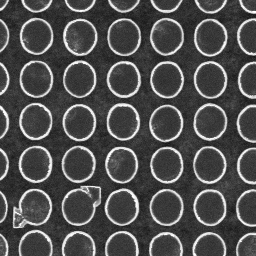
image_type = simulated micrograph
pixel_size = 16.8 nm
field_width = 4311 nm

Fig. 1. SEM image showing a regular array of raised bodies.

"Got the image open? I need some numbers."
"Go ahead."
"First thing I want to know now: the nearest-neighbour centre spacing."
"0.71 micrometres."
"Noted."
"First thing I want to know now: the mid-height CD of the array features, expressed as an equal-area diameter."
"34 px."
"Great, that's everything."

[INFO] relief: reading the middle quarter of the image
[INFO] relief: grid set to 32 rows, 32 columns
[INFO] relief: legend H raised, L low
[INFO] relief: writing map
LHHHHHLLLLLLHHHHHHLLLLLHHHHHLLLL
LHHHHHHLLLLLHHHHHHLLLLHHHHHHHLLL
HHHHHHHHLLLHHHHHHHHLLLHHHHHHHLLL
HHHHHHHHLLLHHHHHHHHLLLHHHHHHHHLL
HHHHHHHHLLLHHHHHHHHLLLHHHHHHHHLL
HHHHHHHHLLLHHHHHHHHLLLHHHHHHHLLL
LHHHHHHLLLLLHHHHHHLLLLLHHHHHHLLL
LLHHHHLLLLLLLHHHHLLLLLLHHHHHLLLL
LLLLLLLLLLLLLLLLLLLLLLLLLLLLLLLL
LLLLLLLLLLLLLLLLLLLLLLLLLLLLLLLL
LLHHHLLLLLLLLHHHHLLLLLLLLLLLLLLL
LHHHHHHLLLLLHHHHHHLLLLLHHHHHLLLL
HHHHHHHLLLLHHHHHHHLLLLHHHHHHHLLL
HHHHHHHHLLLHHHHHHHHLLLHHHHHHHLLL
HHHHHHHHLLLHHHHHHHHLLLHHHHHHHHLL
HHHHHHHHLLLHHHHHHHHLLLHHHHHHHHLL
HHHHHHHHLLLHHHHHHHLLLLHHHHHHHLLL
LHHHHHHLLLLLHHHHHHLLLLHHHHHHHLLL
LLHHHHLLLLLLLHHHHLLLLLLHHHHHLLLL
LLLLLLLLLLLLLLLLLLLLLLLLLLLLLLLL
LLLLLLLLLLLLLLLLLLLLLLLLLLLLLLLL
LHHHHHLLLLLLHHHHLLLLLLLLHHHHLLLL
LHHHHHHLLLLHHHHHHHLLLLLHHHHHHLLL
HHHHHHHHLLLHHHHHHHLLLLHHHHHHHLLL
HHHHHHHHLLLHHHHHHHLLLLHHHHHHHHLL
HHHHHHHHLLLHHHHHHHLLLLHHHHHHHHLL
HHHHHHHLLLLHHHHHHHLLLLHHHHHHHHLL
HHHHHHHLLLLHHHHHHHLLLLHHHHHHHLLL
LHHHHHLLLLLLHHHHHLLLLLLHHHHHLLLL
LLLLLLLLLLLLLHHHLLLLLLLLHHHLLLLL
LLLLLLLLLLLLLLLLLLLLLLLLLLLLLLLL
LLLHHHHHHLLLLLHHLLLLLLLLLHLLLLLL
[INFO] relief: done